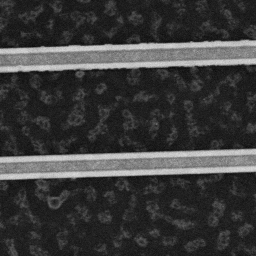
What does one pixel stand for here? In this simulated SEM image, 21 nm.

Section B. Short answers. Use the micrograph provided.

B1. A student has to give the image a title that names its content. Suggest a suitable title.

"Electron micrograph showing one or a few lines or trenches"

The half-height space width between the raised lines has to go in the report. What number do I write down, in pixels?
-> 91.1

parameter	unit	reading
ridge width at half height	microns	0.361